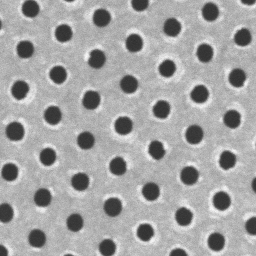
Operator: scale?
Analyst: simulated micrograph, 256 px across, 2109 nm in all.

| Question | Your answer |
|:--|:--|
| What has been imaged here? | a regular array of holes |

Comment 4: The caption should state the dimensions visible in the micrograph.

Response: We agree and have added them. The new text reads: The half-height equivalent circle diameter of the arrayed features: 0.156 microns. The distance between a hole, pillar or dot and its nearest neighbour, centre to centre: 337 nm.